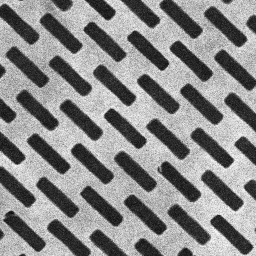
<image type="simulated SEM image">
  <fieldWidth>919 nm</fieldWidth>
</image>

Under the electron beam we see a regular array of holes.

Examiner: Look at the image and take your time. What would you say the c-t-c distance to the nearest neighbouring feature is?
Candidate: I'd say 158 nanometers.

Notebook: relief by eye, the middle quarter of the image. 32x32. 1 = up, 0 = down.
00111111001111111111111000111110
00011110000111111111111101111111
00001110000011111111111111111111
00000111000001111110001111111111
10000011100000111100000111111111
11000001110000011110000011111100
11100001111000001111000001111000
11110011111100000111100000111000
11111111111110000011110000011100
00111111111111000111111000001110
00011111111111111111111100000111
00001111111001111111111110001111
00000111110000111111111111111111
10000011110000011111111111111111
11000001111000001111100011111111
11100000111100000111100001111111
11110000011110000011100000111111
11111100001111000001110000011111
11111110011111100000111000001111
11111111111111110000011100000111
11100111111111111000111110000011
11000011111111111111111111000001
11000001111110001111111111100001
11100000111110000111111111110011
01110000011110000011111110111111
00111000001111000001111100011111
01111100000111100000111100001111
11111110000011110000011100000111
11111111000011111000001110000011
11111111100111111100000111000001
11111101111111111110000111100000
11111000111111111111001111110000